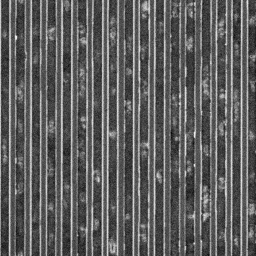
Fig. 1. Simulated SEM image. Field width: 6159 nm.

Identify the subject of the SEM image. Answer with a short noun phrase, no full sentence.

parallel lines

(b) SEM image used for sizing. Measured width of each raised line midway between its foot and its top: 0.156 um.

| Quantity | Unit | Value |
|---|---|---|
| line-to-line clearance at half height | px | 9.38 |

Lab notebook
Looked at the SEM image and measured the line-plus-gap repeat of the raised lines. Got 372 nm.